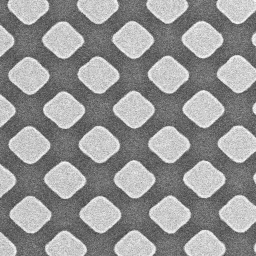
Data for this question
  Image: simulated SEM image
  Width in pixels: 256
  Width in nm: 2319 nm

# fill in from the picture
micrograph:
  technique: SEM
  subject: a regular array of raised bodies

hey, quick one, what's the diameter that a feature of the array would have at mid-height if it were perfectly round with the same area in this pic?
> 0.323 µm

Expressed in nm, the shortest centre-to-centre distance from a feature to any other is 444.